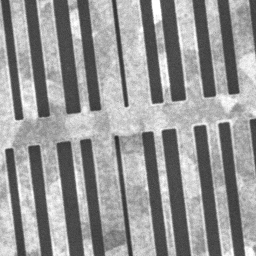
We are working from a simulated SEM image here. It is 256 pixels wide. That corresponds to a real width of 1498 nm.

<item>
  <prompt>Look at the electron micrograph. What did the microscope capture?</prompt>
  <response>groups of lines, slits or small figures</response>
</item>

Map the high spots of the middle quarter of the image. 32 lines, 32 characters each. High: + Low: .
...++...++++++.++++++...+.....++
...++...++++++.++++++...++....++
...++...++++++.++++++...++....++
...++....+++++..+++++....+....++
....+....+++++..+++++....+....++
....++...+++++..+++++....+....++
....++...+++++..+++++....+.....+
....++...++++++.+++++....+.....+
....++...++++++.+++++....++....+
....++...++++++.++++++...++...++
....++...++++++.++++++++++++++++
....++...+++++++++++++++++++++++
+..+++++++++++++++++++++++++++++
++++++++++++++++++++++++++++++++
++++++++++++++++++++++++++++++++
++++++++++++++++++++++++++++++++
++++++++++++++++++++++++....++++
+++++++++++++++++++....+....++++
++++++++++++..+++++....+.....+++
..++...+++++..+++++....+.....+++
..++...+++++..++++++...++....+++
..++...++++++.++++++...++....+++
..++....+++++..+++++...++....+++
..++....+++++..+++++...++....+++
...+....+++++..+++++...++....+++
...+....+++++..+++++...++....+++
...+....+++++..+++++....+....+++
...++...+++++..+++++....+.....++
...++...+++++..++++++...++....++
...++...++++++.++++++...++....++
...++...++++++.++++++...++....++
....+....+++++..+++++...++....++